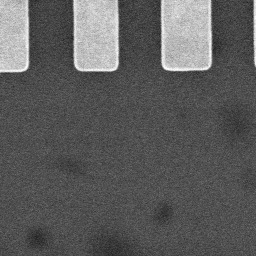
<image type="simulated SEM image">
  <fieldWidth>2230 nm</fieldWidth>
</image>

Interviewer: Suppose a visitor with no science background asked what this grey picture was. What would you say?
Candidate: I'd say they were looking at wiring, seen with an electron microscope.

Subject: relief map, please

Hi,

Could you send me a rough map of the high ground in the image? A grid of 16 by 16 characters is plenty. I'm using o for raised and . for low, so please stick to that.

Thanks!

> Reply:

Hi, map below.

oo...oo...ooo...
oo...oo...ooo...
oo...oo...ooo...
oo...oo...ooo...
................
................
................
................
................
................
................
................
................
................
................
................